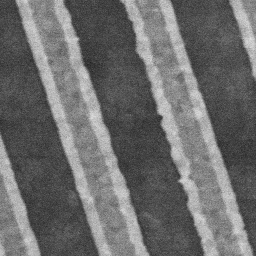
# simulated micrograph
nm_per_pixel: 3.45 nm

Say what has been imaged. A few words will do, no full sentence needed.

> one or a few lines or trenches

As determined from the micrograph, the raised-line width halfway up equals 0.116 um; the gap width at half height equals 236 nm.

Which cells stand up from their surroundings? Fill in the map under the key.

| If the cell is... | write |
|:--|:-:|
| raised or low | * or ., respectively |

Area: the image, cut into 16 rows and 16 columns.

..**....**.....*
..**.....**....*
..**.....**.....
...**....**.....
...**.....**....
...**.....**....
....**....**....
....**....***...
....**.....**...
....***....**...
.....**.....**..
*....**.....**..
*....***....**..
*.....**....***.
**....**.....**.
**....***....**.